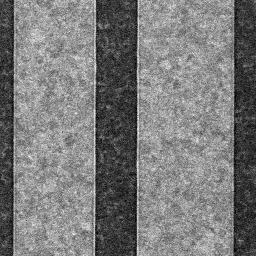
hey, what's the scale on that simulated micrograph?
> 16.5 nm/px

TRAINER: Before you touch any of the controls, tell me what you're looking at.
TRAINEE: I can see one or a few lines or trenches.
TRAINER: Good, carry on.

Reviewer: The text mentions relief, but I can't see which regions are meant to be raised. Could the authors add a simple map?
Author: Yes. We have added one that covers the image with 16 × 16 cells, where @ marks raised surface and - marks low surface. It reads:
-@@@@@---@@@@@@-
-@@@@@---@@@@@@-
-@@@@@---@@@@@@-
-@@@@@---@@@@@@-
-@@@@@---@@@@@@-
-@@@@@---@@@@@@-
-@@@@@---@@@@@@-
-@@@@@---@@@@@@-
-@@@@@---@@@@@@-
-@@@@@---@@@@@@-
-@@@@@---@@@@@@-
-@@@@@---@@@@@@-
-@@@@@---@@@@@@-
-@@@@@---@@@@@@-
-@@@@@---@@@@@@-
-@@@@@---@@@@@@-